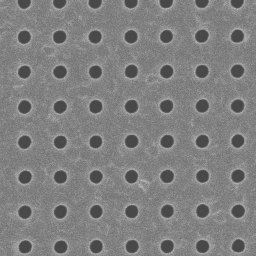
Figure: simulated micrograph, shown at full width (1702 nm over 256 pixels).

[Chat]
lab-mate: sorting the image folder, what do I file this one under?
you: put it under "a regular array of holes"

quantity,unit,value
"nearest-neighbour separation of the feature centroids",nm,230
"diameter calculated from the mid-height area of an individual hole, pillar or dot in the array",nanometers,85.6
